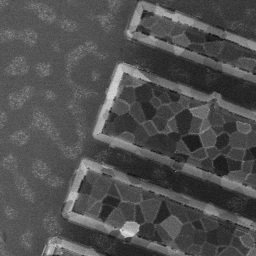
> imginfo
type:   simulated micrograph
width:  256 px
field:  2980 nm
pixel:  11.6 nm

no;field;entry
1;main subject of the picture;one or a few lines or trenches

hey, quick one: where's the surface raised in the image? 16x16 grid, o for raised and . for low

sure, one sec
................
........oooo....
.........oooooo.
............oooo
...............o
.......oooo.....
.......ooooooo..
......oooooooooo
......oooooooooo
.........ooooooo
.....o......oooo
.....oooo.....oo
.....oooooo.....
.....ooooooooo..
.......ooooooooo
...oo.....oooooo